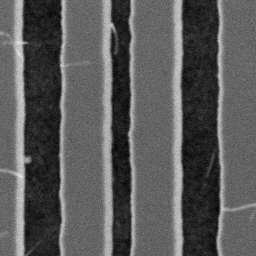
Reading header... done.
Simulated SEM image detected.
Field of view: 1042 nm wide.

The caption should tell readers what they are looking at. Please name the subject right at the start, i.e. lines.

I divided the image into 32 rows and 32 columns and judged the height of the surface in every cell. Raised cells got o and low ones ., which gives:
ooo.....oooooo..ooooooo....ooooo
ooo.....oooooo..oooooo.....ooooo
ooo.....oooooo..oooooo.....ooooo
ooo.....oooooo..ooooooo....ooooo
ooo.....oooooo..ooooooo....ooooo
ooo.....oooooo..ooooooo....ooooo
ooo.....oooooo..ooooooo....ooooo
ooo.....oooooo..ooooooo....ooooo
ooo.....oooooo..oooooo.....ooooo
ooo.....oooooo..oooooo.....ooooo
ooo.....oooooo..oooooo.....ooooo
ooo.....oooooo..oooooo.....ooooo
ooo.....oooooo..oooooo.....ooooo
ooo.....oooooo..oooooo.....ooooo
ooo.....oooooo..ooooooo....ooooo
ooo.....oooooo..oooooo.....ooooo
ooo.....oooooo..oooooo.....ooooo
ooo.....oooooo..oooooo.....ooooo
ooo.....oooooo..oooooo.....ooooo
ooo....ooooooo..oooooo.....ooooo
ooo.....oooooo..oooooo.....ooooo
ooo.....oooooo..ooooooo.....oooo
ooo.....oooooo..ooooooo.....oooo
ooo....ooooooo..ooooooo.....oooo
ooo....ooooooo..oooooo.....ooooo
ooo.....oooooo..oooooo......oooo
ooo.....oooooo..oooooo.....ooooo
ooo.....oooooo..oooooo.....ooooo
ooo.....oooooo..oooooo.....ooooo
ooo....ooooooo..ooooooo....ooooo
ooo....ooooooo..ooooooo....ooooo
ooo.....oooooo..ooooooo....ooooo